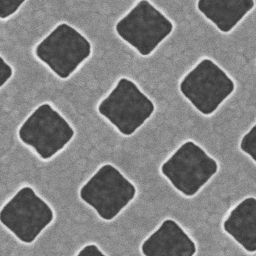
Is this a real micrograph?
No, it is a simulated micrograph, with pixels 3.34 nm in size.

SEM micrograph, holes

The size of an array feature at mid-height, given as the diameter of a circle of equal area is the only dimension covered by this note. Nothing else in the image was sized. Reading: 163 nanometres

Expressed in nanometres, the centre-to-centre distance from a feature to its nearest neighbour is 279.